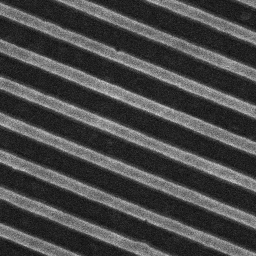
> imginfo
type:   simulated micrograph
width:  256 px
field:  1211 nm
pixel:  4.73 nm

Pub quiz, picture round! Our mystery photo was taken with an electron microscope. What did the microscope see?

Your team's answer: parallel lines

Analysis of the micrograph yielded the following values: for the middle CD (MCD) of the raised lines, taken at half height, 63.1 nm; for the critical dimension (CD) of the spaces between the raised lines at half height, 0.0993 µm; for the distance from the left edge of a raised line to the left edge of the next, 161 nm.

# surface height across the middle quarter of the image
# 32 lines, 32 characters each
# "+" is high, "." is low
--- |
+..............+++++++++........
++++..............++++++++......
++++++..............++++++++....
++++++++...............++++++++.
..+++++++++..............+++++++
.....++++++++...............++++
.......+++++++++..............++
..........++++++++..............
............+++++++++...........
...............++++++++.........
+++..............+++++++++......
+++++..............+++++++++....
++++++++..............+++++++++.
..++++++++..............++++++++
....+++++++++..............+++++
......+++++++++..............+++
.........+++++++++..............
...........+++++++++............
..............+++++++++.........
++..............+++++++++.......
+++++..............+++++++++....
+++++++..............+++++++++..
.+++++++++..............++++++++
....++++++++..............++++++
......+++++++++..............+++
........+++++++++..............+
...........++++++++.............
.............+++++++++..........
++..............+++++++++.......
++++..............+++++++++.....
++++++...............+++++++++..
.++++++++..............+++++++++